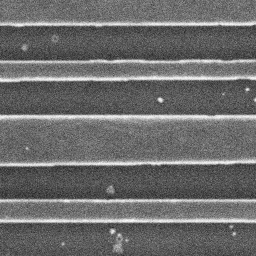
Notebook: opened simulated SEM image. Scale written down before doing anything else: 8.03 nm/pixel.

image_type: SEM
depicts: lines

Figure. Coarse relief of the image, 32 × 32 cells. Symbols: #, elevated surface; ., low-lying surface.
################################
################################
################################
................................
................................
................................
................................
................................
################################
################################
................................
................................
................................
................................
##############.......####...####
################################
################################
################################
################################
################################
#################...............
................................
................................
................................
................................
################################
################################
################################
................................
................................
................................
................................